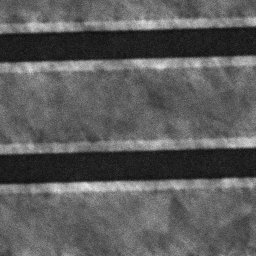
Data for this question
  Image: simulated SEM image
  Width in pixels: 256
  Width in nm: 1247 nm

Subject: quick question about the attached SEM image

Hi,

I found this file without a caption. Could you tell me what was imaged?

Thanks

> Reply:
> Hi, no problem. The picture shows one or a few lines or trenches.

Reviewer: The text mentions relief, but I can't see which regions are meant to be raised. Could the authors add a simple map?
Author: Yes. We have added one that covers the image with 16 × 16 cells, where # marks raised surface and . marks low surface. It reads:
################
###########.....
................
................
################
################
################
################
################
................
................
............####
################
################
################
################